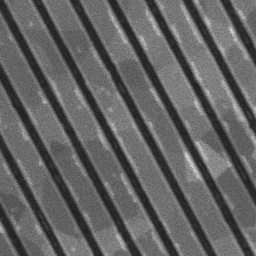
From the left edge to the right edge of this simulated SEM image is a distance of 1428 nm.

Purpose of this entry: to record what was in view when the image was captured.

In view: parallel lines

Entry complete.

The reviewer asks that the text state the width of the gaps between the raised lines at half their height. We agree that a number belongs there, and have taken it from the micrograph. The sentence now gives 9.8 pixels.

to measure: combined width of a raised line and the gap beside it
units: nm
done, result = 185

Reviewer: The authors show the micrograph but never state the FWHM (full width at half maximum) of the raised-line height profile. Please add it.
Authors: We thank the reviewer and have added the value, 130 nm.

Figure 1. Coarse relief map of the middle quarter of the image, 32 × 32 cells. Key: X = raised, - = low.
X--XXXXXXX---XXXXXX---XXXXXXX---
X---XXXXXXX---XXXXXX---XXXXXX---
XX---XXXXXX---XXXXXX----XXXXXX--
XX---XXXXXXX---XXXXXX---XXXXXX--
XXX--XXXXXXX---XXXXXX----XXXXXX-
XXX---XXXXXXX---XXXXXX---XXXXXXX
XXXX---XXXXXX---XXXXXXX---XXXXXX
XXXX---XXXXXXX---XXXXXX---XXXXXX
XXXXX---XXXXXX---XXXXXXX---XXXXX
XXXXX---XXXXXXX---XXXXXX---XXXXX
XXXXXX---XXXXXX---XXXXXXX---XXXX
XXXXXXX--XXXXXXX---XXXXXX---XXXX
-XXXXXX---XXXXXX----XXXXXX---XXX
-XXXXXXX--XXXXXXX---XXXXXX---XXX
--XXXXXX---XXXXXX----XXXXXX---XX
--XXXXXXX---XXXXXX---XXXXXX----X
---XXXXXX---XXXXXXX--XXXXXXX---X
---XXXXXXX---XXXXXX---XXXXXX----
X---XXXXXX---XXXXXXX---XXXXXX---
X---XXXXXXX---XXXXXX---XXXXXXX--
XX---XXXXXX---XXXXXXX---XXXXXX--
XXX--XXXXXXX---XXXXXX---XXXXXXX-
XXX---XXXXXX---XXXXXXX---XXXXXX-
XXX---XXXXXXX---XXXXXX---XXXXXXX
XXXX---XXXXXXX--XXXXXXX---XXXXXX
XXXXX---XXXXXX---XXXXXX----XXXXX
XXXXX---XXXXXXX--XXXXXXX---XXXXX
XXXXXX---XXXXXX---XXXXXX----XXXX
XXXXXX---XXXXXXX---XXXXXX---XXXX
XXXXXXX---XXXXXX---XXXXXXX---XXX
-XXXXXX---XXXXXXX---XXXXXX---XXX
-XXXXXXX---XXXXXX---XXXXXXX---XX